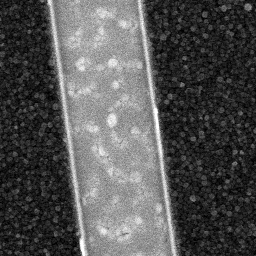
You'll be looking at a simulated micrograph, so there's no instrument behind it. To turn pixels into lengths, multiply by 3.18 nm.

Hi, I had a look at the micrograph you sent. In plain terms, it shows one or a few lines or trenches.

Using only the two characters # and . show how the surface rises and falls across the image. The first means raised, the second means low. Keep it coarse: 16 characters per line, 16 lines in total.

###......#######
###......#######
####.....#######
####.....#######
####.....#######
####.....#######
####......######
####......######
####......######
####......######
#####.....######
#####.....######
#####.....######
#####......#####
#####......#####
#####......#####